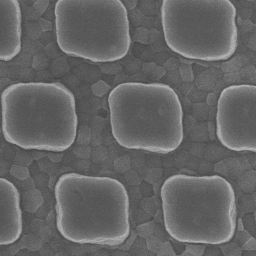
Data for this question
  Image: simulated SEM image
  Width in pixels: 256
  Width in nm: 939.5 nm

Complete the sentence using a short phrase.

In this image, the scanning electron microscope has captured raised bodies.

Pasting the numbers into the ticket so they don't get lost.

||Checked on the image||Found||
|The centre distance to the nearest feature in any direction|390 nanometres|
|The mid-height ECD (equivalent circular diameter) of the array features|271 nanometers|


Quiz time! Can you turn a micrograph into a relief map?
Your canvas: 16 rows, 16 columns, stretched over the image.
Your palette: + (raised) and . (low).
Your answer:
+..+++++..+++++.
+...++++..+++++.
+...++++..+++++.
+....+++....++..
................
.+++...++++...++
+++++..++++...++
+++++..++++...++
+++++..++++...++
................
................
+...+++...++++..
+...++++..+++++.
+...++++..+++++.
+...++++...+++..
................